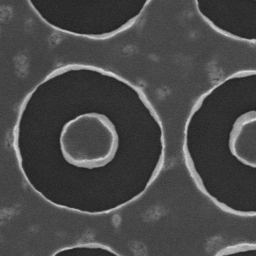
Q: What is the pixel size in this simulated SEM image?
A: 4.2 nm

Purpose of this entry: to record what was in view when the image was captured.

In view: ring-shaped grooves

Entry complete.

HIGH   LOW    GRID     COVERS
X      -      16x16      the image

XX-------XXX----
XXX-----XXXXX---
XXXXXXXXXXXXXXXX
XXXXXXXXXXXXXXXX
XXXX--XXXXXXXXXX
XX------XXXXXX--
XX-------XXX----
X----X----XX---X
X---XXX---XX---X
X---XXX---XX---X
X---------XX----
XX-------XXX----
XXX-----XXXXX---
XXXXXXXXXXXXXXXX
XXXXXXXXXXXXXXXX
XXXXX--XXXXXXXXX